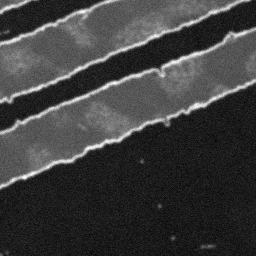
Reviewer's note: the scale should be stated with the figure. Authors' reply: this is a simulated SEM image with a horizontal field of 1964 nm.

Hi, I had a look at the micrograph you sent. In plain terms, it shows one or a few lines or trenches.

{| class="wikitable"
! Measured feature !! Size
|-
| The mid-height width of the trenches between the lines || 0.391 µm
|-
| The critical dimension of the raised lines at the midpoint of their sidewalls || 0.224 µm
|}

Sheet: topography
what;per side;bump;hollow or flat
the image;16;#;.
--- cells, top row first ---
.#####........##
###.........####
#........#####..
.......#####....
.....####.......
..####.........#
####.........###
##........######
........########
.....###########
...#############
################
################
################
################
################